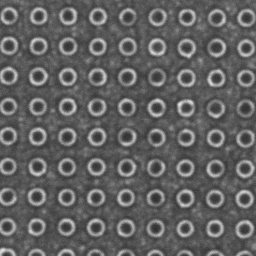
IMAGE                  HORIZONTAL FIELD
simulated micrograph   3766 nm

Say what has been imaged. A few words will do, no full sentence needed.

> a regular array of raised bodies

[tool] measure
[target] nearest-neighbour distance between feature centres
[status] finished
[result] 0.433 micrometres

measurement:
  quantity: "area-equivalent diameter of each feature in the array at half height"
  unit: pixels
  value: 16.5